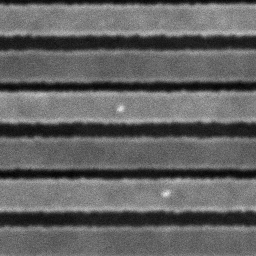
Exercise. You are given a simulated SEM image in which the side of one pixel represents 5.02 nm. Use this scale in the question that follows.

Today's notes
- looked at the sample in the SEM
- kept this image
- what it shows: lines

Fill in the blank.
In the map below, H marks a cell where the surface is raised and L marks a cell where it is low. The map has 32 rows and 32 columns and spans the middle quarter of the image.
HHHHHHHHHHHHHHHHHHHHHHHHHHHHHHHH
HHHHHHHHHHHHHHHHHHHHHHHHHHHHHHHH
HHHHHHHHHHHHHHHHHHHHHHHHHHHHHHHH
HHHHHHHHHHHHHHHHHHHHHHHHHHHHHHHH
LLLLHLLLLLLLLLLLLLLLLLLLLLLLLLLL
LLLLLLLLLLLLLLLLLLLLLLLLLLLLLLLL
LLLLLLLLLLLLLLLLLLLLLLLLLLLLLLLL
HHHHHHHHHHHHHHHHHHHHHHHHHHHHHHHH
HHHHHHHHHHHHHHHHHHHHHHHHHHHHHHHH
HHHHHHHHHHHHHHHHHHHHHHHHHHHHHHHH
HHHHHHHHHHHHHHHHHHHHHHHHHHHHHHHH
HHHHHHHHHHHHHHHHHHHHHHHHHHHHHHHH
HHHHHHHHHHHHHHHHHHHHHHHHHHHHHHHH
HHHHHHHHHHHHHHHHHHHHHHHHHHHHHHHH
HHLLLHHHHHHHHHHHHHHHHHHHHHHLLHHH
LLLLLLLLLLLLLLLLLLLLLLLLLLLLLLLL
LLLLLLLLLLLLLLLLLLLLLLLLLLLLLLLL
LLLLLLLLLLLLLLLLLLLLLLLLLLLLLLLL
LLHHHHHLLLHLLHLHLLLHHHLLLLHHLHHH
HHHHHHHHHHHHHHHHHHHHHHHHHHHHHHHH
HHHHHHHHHHHHHHHHHHHHHHHHHHHHHHHH
HHHHHHHHHHHHHHHHHHHHHHHHHHHHHHHH
HHHHHHHHHHHHHHHHHHHHHHHHHHHHHHHH
HHHHHHHHHHHHHHHHHHHHHHHHHHHHHHHH
HHHHHHHHHHHHHHHHHHHHHHHHHHHHHHHH
HHHHHHHHHHHHHHHHHHHHHHHHHHHHHHHH
LLLLLLLLLLLLLLLLLLLLLLLLLLLLLLLL
LLLLLLLLLLLLLLLLLLLLLLLLLLLLLLLL
LLLLLLLLLLLLLLLLLLLLLLLLLLLLLLLL
HHHHHHHHHHHHHHHHHHHHHHHHHHHHHHHH
HHHHHHHHHHHHHHHHHHHHHHHHHHHHHHHH
HHHHHHHHHHHHHHHHHHHHHHHHHHHHHHHH